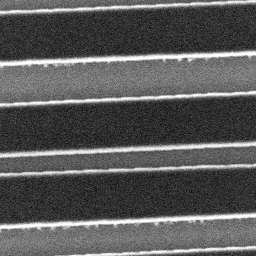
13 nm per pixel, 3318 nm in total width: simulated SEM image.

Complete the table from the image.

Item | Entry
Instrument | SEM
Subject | lines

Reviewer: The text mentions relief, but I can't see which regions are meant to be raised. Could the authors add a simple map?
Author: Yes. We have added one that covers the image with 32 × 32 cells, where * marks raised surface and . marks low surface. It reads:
........................********
********************************
********************************
********************************
********************************
********************************
********************************
***********.....................
................................
................................
................................
................................
...........*********************
********************************
********************************
********************************
********************************
********************************
*********************...........
................................
................................
.........***********************
********************************
********************************
********************************
********************************
********************************
*******************.............
................................
................................
................................
...................*************